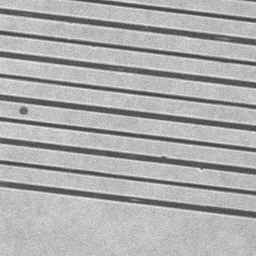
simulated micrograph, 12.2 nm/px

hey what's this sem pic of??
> parallel lines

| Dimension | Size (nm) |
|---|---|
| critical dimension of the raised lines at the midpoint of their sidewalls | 186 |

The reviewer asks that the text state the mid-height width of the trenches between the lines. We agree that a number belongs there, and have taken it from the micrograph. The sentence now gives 86.2 nm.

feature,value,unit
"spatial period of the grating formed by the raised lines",0.261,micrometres